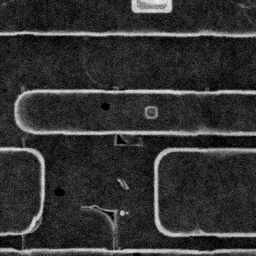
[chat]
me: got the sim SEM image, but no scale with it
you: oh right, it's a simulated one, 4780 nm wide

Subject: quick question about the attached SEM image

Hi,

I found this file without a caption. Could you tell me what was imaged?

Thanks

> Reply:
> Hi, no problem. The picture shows wiring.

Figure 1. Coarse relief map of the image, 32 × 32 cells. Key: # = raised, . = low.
#################....###########
################################
################################
################################
................................
................................
................................
................................
................................
................................
................................
....###.#####..####.............
..##############################
..##############################
..##############################
...#############################
....############################
................................
................................
#####...............############
#####..............#############
#####..............#############
#####..............#############
#####..............#############
#####..............#############
#####...............############
#####...............############
#####...............############
####................############
................................
................................
#########################.######